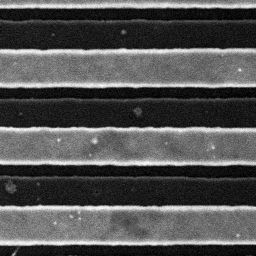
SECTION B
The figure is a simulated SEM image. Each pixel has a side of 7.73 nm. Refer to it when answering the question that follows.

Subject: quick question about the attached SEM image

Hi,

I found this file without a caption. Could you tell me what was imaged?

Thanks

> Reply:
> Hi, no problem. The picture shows lines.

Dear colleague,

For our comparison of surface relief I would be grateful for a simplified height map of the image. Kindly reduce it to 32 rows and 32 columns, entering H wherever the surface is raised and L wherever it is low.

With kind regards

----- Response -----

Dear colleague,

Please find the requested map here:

HHHHHHHHHHHHHHHHHHHHHHHHHHHHHHHH
LLLLLLLLLLLLLLLLLLLLLLLLLLLLLLLL
LLLLLLLLLLLLLLLLLLLLLLLLLLLLLLLL
LLLLLLLLLLLLLLLLLLLLLLLLLLLLLLLL
LLLLLLLLLLLLLLLLLLLLLLLLLLLLLLLL
LLLLLLLLLLLLLLLLLLLLLLLLLLLLLLLL
HHHHHHHHHHHHHHHHHHHHHHHHHHHHHHHH
HHHHHHHHHHHHHHHHHHHHHHHHHHHHHHHH
HHHHHHHHHHHHHHHHHHHHHHHHHHHHHHHH
HHHHHHHHHHHHHHHHHHHHHHHHHHHHHHHH
HHHHHHHHHHHHHHHHHHHHHHHHHHHHHHHH
LLLLLLLLLLLLLLLLLLLLLLLLLLLLLLLL
LLLLLLLLLLLLLLLLLLLLLLLLLLLLLLLL
LLLLLLLLLLLLLLLLLLLLLLLLLLLLLLLL
LLLLLLLLLLLLLLLLLLLLLLLLLLLLLLLL
LLLLLLLLLLLLLLLLLLLLLLLLLLLLLLLL
HHHHHHHHHHHHHHHHHHHHHHHHHHHHHHHH
HHHHHHHHHHHHHHHHHHHHHHHHHHHHHHHH
HHHHHHHHHHHHHHHHHHHHHHHHHHHHHHHH
HHHHHHHHHHHHHHHHHHHHHHHHHHHHHHHH
HHHHHHHHHHHHHHHHHHHHHHHHHHHHHHHH
LLLLLLLLLLLLLLLLLLLLLLLLLLLLLLLL
LLLLLLLLLLLLLLLLLLLLLLLLLLLLLLLL
LLLLLLLLLLLLLLLLLLLLLLLLLLLLLLLL
LLLLLLLLLLLLLLLLLLLLLLLLLLLLLLLL
LLLLLLLLLLLLLLLLLLLLLLLLLLLLLLLL
HHHHHHHHHHHHHHHHHHHHHHHHHHHHHHHH
HHHHHHHHHHHHHHHHHHHHHHHHHHHHHHHH
HHHHHHHHHHHHHHHHHHHHHHHHHHHHHHHH
HHHHHHHHHHHHHHHHHHHHHHHHHHHHHHHH
HHHHHHHHHHHHHHHHHHHHHHHHHHHHHHHH
LLLLLLLLLLLLLLLLLLLLLLLLLLLLLLLL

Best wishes